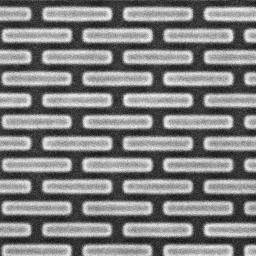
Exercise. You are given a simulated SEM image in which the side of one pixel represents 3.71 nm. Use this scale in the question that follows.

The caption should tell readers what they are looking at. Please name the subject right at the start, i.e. groups of lines, slits or small figures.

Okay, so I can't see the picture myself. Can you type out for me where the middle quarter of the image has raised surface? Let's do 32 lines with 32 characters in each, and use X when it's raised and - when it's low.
--------------------------------
--------------------------------
X----XXXXXXXXXXXXXXXXX---XXXXXXX
XX---XXXXXXXXXXXXXXXXX---XXXXXXX
XX---XXXXXXXXXXXXXXXXX---XXXXXXX
--------------------------------
--------------------------------
--------------------------------
XXXXXXXXXXXX---XXXXXXXXXXXXXXXXX
XXXXXXXXXXXX---XXXXXXXXXXXXXXXXX
--------------------------------
--------------------------------
--------------------------------
X----XXXXXXXXXXXXXXXXX---XXXXXXX
X----XXXXXXXXXXXXXXXXX---XXXXXXX
X----XXXXXXXXXXXXXXXXX---XXXXXXX
--------------------------------
--------------------------------
XXXXXXXXXXX-----XXXXXXX---XXXXX-
XXXXXXXXXXXX---XXXXXXXXXXXXXXXXX
XXXXXXXXXXXX---XXXXXXXXXXXXXXXXX
--------------------------------
--------------------------------
--------------------------------
XX---XXXXXXXXXXXXXXXXX---XXXXXXX
XX---XXXXXXXXXXXXXXXXX---XXXXXXX
X----XXXXXXXXXXXXXXXX----XXXXXXX
--------------------------------
--------------------------------
XXXXXXXXXXX----XXXXXXXXXXXXXXXXX
XXXXXXXXXXXX---XXXXXXXXXXXXXXXXX
XXXXXXXXXXXX---XXXXXXXXXXXXXXXXX